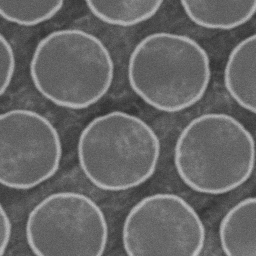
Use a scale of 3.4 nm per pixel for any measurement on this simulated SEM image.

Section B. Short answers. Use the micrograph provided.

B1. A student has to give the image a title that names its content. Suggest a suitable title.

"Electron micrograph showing raised bodies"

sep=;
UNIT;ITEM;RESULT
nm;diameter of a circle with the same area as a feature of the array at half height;262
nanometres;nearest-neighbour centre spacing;321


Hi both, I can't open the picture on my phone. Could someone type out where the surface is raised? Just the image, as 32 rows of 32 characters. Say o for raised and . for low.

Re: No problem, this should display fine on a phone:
oooooooo...ooooooooo...ooooooooo
ooooooo.....ooooooo.....oooooooo
..ooo........oooo.......ooooooo.
................................
......ooooo........ooo..........
o....oooooooo.....oooooo......oo
o....oooooooo....oooooooo....ooo
oo..oooooooooo..oooooooooo...ooo
oo..oooooooooo..oooooooooo..oooo
o...oooooooooo..oooooooooo..oooo
o....ooooooooo...ooooooooo..oooo
.....oooooooo....oooooooo....ooo
.......ooooo......oooooo......oo
....................ooo........o
ooooo........ooo..........oo....
oooooo.....ooooooo......oooooo..
ooooooo....oooooooo....oooooooo.
ooooooo...oooooooooo..ooooooooo.
ooooooo...oooooooooo..oooooooooo
ooooooo...oooooooooo..oooooooooo
ooooooo...ooooooooo...ooooooooo.
ooooooo....oooooooo....oooooooo.
ooooo.......oooooo.....oooooooo.
.............o.o........ooooo...
.......ooo..........o...........
.....ooooooo......ooooo.......oo
....ooooooooo....ooooooo.....ooo
o...ooooooooo...ooooooooo...oooo
o...ooooooooo...ooooooooo...oooo
o...ooooooooo...ooooooooo...oooo
o...ooooooooo...ooooooooo...oooo
.....oooooooo...ooooooooo...oooo